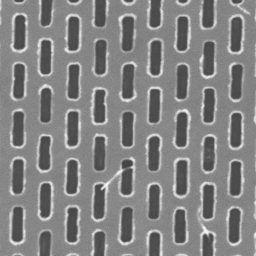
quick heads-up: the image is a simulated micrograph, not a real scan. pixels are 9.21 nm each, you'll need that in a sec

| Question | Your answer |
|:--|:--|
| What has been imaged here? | a regular array of holes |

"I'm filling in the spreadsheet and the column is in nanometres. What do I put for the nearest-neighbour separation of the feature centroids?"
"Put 329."